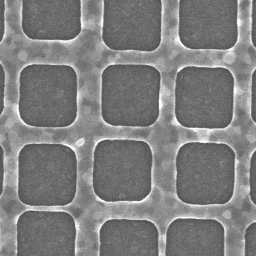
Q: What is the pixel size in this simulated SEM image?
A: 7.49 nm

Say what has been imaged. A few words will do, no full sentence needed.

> holes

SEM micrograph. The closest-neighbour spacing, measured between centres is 566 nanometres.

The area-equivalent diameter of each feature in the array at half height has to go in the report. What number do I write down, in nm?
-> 500